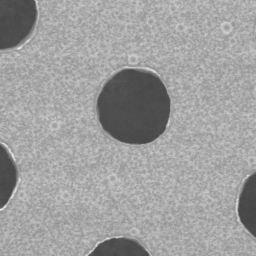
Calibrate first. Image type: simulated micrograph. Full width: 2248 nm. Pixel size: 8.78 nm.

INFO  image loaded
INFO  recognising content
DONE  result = holes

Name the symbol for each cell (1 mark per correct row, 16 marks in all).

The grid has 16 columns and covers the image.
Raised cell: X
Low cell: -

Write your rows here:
--XXXXXXXXXXXXXX
--XXXXXXXXXXXXXX
--XXXXXXXXXXXXXX
XXXXXXXXXXXXXXXX
XXXXXXX--XXXXXXX
XXXXXX----XXXXXX
XXXXXX-----XXXXX
XXXXXX-----XXXXX
XXXXXXX---XXXXXX
-XXXXXXXXXXXXXXX
-XXXXXXXXXXXXXXX
-XXXXXXXXXXXXXX-
-XXXXXXXXXXXXXX-
XXXXXXXXXXXXXXX-
XXXXXXXXXXXXXXXX
XXXXXX---XXXXXXX